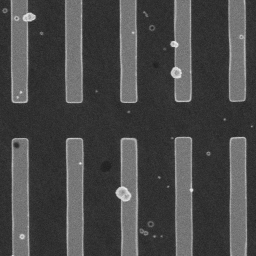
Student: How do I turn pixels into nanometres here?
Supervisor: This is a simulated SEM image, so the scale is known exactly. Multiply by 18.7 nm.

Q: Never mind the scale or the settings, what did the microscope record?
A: groups of lines, slits or small figures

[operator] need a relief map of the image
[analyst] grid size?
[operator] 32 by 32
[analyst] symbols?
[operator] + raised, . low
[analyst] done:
.++.....++.....++.....++.....++.
.+++....++.....++.....++.....++.
.+++....++.....++.....++.....++.
.++.....++.....++.....++.....++.
.++.....++.....++.....++.....++.
.++.....++.....++.....++.....++.
.++.....++.....++.....++.....++.
.++.....++.....++.....++.....++.
.++.....++.....++.....++.....++.
.++.....++.....++.....++.....++.
..+.....++.....++.....++.....++.
..+.....++.....++.....++.....++.
..+.....++.....++.....++.....+..
................................
................................
................................
................................
..+.....++.....++.....++.....++.
..+.....++.....++.....++.....++.
..+.....++.....++.....++.....++.
..++....++.....++.....++.....++.
..++....++.....++.....++.....++.
..++....++.....++.....++.....++.
..+.....++.....++.....++.....++.
..++....++.....++.....++.....++.
..++....++.....++.....++.....++.
..++....++.....++.....++.....++.
..++....++.....++.....++.....++.
..++....++.....++.....++.....++.
..++....++.....++.....++.....++.
..++....++.....++.....++.....++.
..++....++.....++.....++.....++.